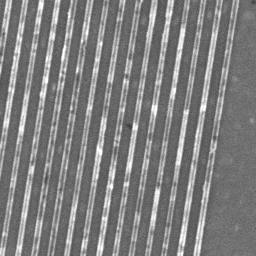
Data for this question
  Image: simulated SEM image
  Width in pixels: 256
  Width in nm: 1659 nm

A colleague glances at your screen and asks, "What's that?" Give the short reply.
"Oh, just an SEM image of parallel lines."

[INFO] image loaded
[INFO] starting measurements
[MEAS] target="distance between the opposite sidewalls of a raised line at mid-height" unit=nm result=25.6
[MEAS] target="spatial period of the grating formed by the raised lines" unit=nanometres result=104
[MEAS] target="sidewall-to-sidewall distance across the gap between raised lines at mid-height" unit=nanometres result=76.8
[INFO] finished